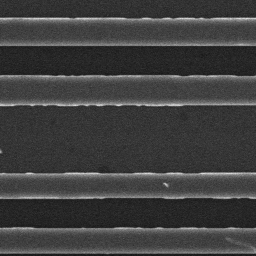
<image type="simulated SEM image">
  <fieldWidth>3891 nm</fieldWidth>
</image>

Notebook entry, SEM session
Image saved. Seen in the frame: lines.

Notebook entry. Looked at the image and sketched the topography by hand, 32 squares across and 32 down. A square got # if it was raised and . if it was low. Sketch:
................................
................................
################################
################################
################################
################################
................................
................................
................................
##############################..
################################
################################
################################
................................
................................
................................
................................
................................
................................
................................
................................
................................
################################
################################
################################
................................
................................
................................
#####.....#...####.##.####..##.#
################################
################################
################################